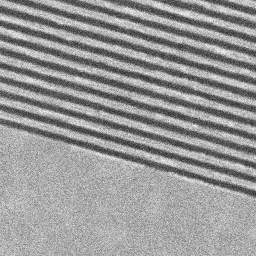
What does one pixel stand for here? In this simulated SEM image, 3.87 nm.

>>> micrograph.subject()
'parallel lines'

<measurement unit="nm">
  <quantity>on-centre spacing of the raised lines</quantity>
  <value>51.9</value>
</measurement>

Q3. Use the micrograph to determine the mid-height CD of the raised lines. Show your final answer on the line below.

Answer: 0.0241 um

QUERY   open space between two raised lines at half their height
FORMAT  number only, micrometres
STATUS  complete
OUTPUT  0.0279